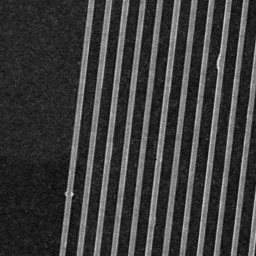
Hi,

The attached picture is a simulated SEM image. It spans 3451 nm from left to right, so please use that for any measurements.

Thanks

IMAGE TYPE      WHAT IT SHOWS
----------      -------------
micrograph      parallel lines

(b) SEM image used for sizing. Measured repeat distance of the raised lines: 230 nanometres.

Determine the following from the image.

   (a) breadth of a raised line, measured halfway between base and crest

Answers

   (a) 68.6 nm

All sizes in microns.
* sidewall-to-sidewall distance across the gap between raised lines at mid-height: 0.161